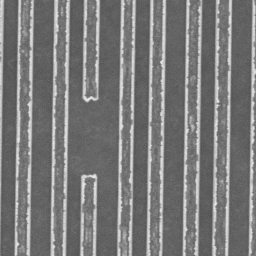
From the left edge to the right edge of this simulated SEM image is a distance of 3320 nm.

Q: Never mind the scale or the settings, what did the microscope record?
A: parallel lines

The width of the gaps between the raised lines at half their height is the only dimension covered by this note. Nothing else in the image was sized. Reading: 21.4 pixels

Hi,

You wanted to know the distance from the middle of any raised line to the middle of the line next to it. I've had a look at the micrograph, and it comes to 428 nm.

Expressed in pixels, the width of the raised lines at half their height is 14.6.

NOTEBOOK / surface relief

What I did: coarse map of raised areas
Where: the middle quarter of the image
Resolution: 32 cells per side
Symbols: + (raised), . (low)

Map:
+....++++.....+++.....+++......+
+....++++.....+++.....+++......+
+....++++.....+++.....+++......+
+....++++.....+++.....+++......+
+....+++......+++.....+++......+
+....+++......+++.....+++......+
+....+++......+++.....+++......+
+....+++......+++.....+++......+
+....+++......+++.....+++......+
+.............+++.....+++......+
+.............+++.....+++......+
+.............+++.....+++......+
+.............+++.....+++......+
+.............+++....++++......+
+.............+++....++++.....++
+.............+++....++++.....++
+.............+++....++++.....++
+.............+++....++++.....++
+.............+++....++++.....++
+.............+++....++++.....++
+.............+++....++++.....++
+.............+++....++++.....++
+.............+++....++++.....++
+.............+++....++++.....++
+.............+++....++++.....++
+.............+++....+++......++
+.............+++....+++......++
+.............+++....+++......++
+...++++......+++....+++......++
+...++++......+++....+++......++
+...++++......+++....+++......++
+...++++......+++....+++......++